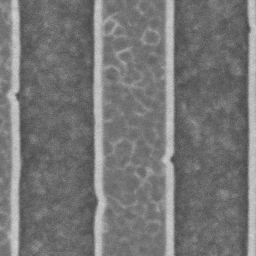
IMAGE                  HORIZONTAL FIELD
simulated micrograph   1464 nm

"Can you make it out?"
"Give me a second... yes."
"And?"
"one or a few lines or trenches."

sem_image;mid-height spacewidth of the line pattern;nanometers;472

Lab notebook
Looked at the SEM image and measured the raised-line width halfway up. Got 414 nm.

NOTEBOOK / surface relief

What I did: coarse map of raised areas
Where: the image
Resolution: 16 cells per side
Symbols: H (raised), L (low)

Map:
HLLLLLHHHHHLLLLL
HLLLLLHHHHHLLLLL
HLLLLLHHHHHLLLLL
HLLLLLHHHHHLLLLL
HLLLLLHHHHHLLLLL
HLLLLLHHHHHLLLLL
HLLLLLHHHHHLLLLL
HLLLLLHHHHHLLLLL
HLLLLLHHHHHLLLLL
HLLLLLHHHHHLLLLL
HLLLLLHHHHHLLLLL
HLLLLLHHHHHLLLLL
HLLLLLHHHHHLLLLL
HLLLLLHHHHHLLLLL
HLLLLLHHHHHLLLLL
HLLLLLHHHHHLLLLL